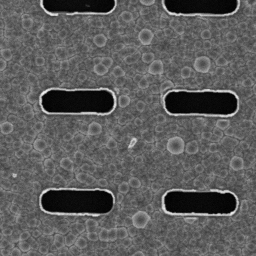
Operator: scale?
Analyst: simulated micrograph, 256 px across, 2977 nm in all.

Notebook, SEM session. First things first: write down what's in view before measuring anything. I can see holes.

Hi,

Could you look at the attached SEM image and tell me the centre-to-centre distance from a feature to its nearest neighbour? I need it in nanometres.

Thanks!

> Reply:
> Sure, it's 1160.